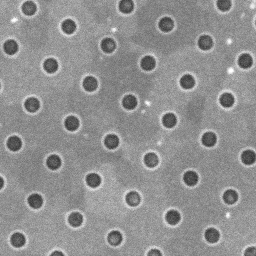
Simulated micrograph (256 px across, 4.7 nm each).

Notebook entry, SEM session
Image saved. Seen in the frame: a regular array of holes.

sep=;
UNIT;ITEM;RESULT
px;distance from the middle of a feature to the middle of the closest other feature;42.9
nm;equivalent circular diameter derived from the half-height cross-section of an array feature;79.6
